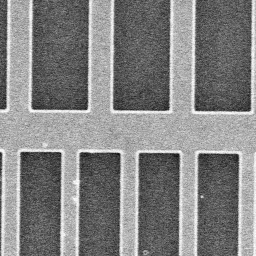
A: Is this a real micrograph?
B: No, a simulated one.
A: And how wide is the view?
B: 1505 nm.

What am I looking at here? groups of lines, slits or small figures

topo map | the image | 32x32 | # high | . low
.###.......###.......###........
.###.......###.......###........
.###.......###.......###........
.###.......###.......###........
.###.......###.......###........
.###.......###.......###........
.###.......###.......###........
.###.......###.......###........
.###.......###.......###........
.###.......###.......###........
.###.......###.......###........
.###.......###.......###........
.###.......###.......###........
.###.......###.......###.......#
################################
################################
################################
################################
################################
##......##.....##......##.....##
##......##.....##......##.....##
##......##.....##......#......##
##......##.....##......#......##
##......##.....##......#......##
##......##.....##......#......##
##......##.....##......#......##
##......##.....##......#......##
##......##.....##......#......##
##......##.....##......#......##
##......##.....##......#......##
##......##.....##......#......##
##......##.....##......#......##